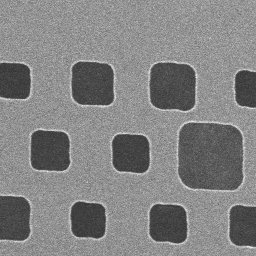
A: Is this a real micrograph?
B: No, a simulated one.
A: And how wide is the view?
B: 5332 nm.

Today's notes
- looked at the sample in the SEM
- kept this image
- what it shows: holes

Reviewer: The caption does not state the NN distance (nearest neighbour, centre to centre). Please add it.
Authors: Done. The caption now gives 1650 nanometers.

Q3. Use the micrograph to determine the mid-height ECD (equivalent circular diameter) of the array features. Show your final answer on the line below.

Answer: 888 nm